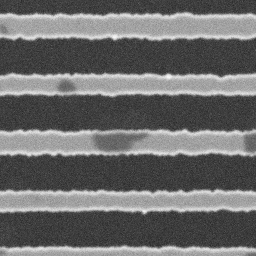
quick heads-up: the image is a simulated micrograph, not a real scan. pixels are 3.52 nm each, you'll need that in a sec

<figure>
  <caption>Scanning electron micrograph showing lines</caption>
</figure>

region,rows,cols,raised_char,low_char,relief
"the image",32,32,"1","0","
00000000000000000000000000000000
00000000000000000000000000000000
11111111111111111111111111111111
11111111111111111111111111111111
11111111111111111111111111111111
00000000000000000000000000000000
00000000000000000000000000000000
00000000000000000000000000000000
00000000000000000000000000000000
11111111111111111111111111101111
11111111111111111111111111111111
11111111111111111111111111111111
00000000000000000000000000000000
00000000000000000000000000000000
00000000000000000000000000000000
00000000000000000000000000000000
11111111001111111111101101110111
11111111111111111111111111111111
11111111111111111111111111111111
00000000000000000000000000000000
00000000000000000000000000000000
00000000000000000000000000000000
00000000000000000000000000000000
00000000000000000000000000000000
11111111111111111111111111111111
11111111111111111111111111111111
00000000000000000000000000000000
00000000000000000000000000000000
00000000000000000000000000000000
00000000000000000000000000000000
00000000000000000000000000000000
11111111111111111111111111111111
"